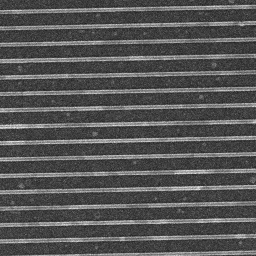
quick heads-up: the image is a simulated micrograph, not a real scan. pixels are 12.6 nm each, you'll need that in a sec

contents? parallel lines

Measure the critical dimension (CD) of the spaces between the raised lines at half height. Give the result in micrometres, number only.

0.171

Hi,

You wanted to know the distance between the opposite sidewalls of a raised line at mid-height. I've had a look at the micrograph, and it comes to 34.5 nanometres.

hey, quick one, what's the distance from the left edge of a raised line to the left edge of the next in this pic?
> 0.206 microns